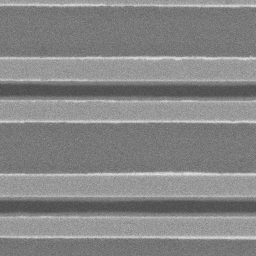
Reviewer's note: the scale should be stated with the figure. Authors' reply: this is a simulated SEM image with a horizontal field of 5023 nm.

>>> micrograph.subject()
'lines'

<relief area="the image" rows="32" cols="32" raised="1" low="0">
11111111111111111111111111111111
00000000000000000000000000000000
00000000000000000000000000000000
00000000000000000000000000000000
00000000000000000000000000000000
00000000000000000000000000000000
00000000000000000000000000000000
11111111111111111111111111111111
11111111111111111111111111111111
11111111111111111111111111111111
00000000000000000000000000000000
00000000000000000000000000000000
00000000000000000000000000000000
11111111111111111111111111111111
11111111111111111111111111111111
00000000000000000000000000000000
00000000000000000000000000000000
00000000000000000000000000000000
00000000000000000000000000000000
00000000000000000000000000000000
00000000000000000000000000000000
00000000000000000000000000000000
11111111111111111111111111111111
11111111111111111111111111111111
11111111111111111111111111111111
00000000000000000000000000000000
00000000000000000000000000000000
11111111111111111111111111111111
11111111111111111111111111111111
11111111111111111111111111111111
00000000000000000000000000000000
00000000000000000000000000000000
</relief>